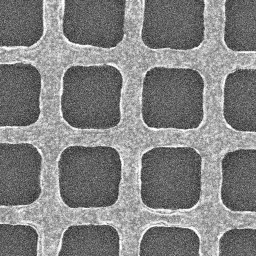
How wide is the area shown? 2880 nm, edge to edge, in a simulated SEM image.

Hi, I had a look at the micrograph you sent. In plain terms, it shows holes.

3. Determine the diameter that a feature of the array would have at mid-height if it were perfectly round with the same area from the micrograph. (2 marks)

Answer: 764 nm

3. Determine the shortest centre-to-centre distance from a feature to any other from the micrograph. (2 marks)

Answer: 897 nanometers